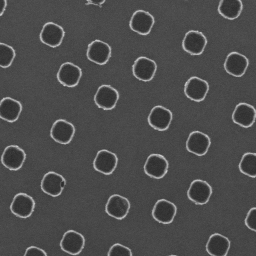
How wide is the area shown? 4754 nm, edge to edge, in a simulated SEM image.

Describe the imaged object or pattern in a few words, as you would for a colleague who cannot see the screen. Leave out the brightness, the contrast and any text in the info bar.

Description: a regular array of raised bodies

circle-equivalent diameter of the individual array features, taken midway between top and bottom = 427 nanometers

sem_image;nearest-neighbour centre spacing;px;46